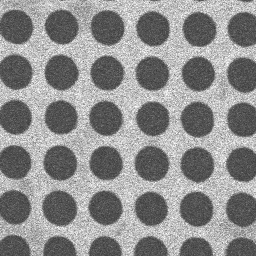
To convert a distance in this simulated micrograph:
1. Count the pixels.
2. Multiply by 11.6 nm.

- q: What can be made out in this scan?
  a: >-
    a regular array of holes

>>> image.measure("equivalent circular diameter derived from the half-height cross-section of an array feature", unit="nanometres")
395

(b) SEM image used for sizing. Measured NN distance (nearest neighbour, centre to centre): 0.518 µm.